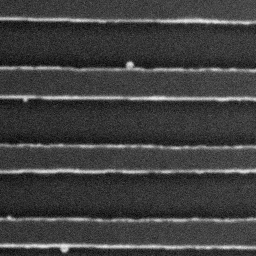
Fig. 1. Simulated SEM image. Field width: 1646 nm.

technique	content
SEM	lines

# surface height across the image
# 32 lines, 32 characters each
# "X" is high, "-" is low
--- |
XXXXXXXXXXXXXXXXXXXXXXXXXXXXXXXX
XXXXXXXXXXXXXXXXXXXXXXXXXXXXXXXX
---------XXXXXXXXXXXXXXXXXXXXXXX
--------------------------------
--------------------------------
--------------------------------
--------------------------------
--------------------------------
XXXXXXXX------------------------
XXXXXXXXXXXXXXXXXXXXXXXXXXXXXXXX
XXXXXXXXXXXXXXXXXXXXXXXXXXXXXXXX
XXXXXXXXXXXXXXXXXXXXXXXXXXXXXXXX
--------------------------------
--------------------------------
--------------------------------
--------------------------------
--------------------------------
--------------------------------
XXXXXXXXXXXXXXXXXXXXXXXXXXXXXXXX
XXXXXXXXXXXXXXXXXXXXXXXXXXXXXXXX
XXXXXXXXXXXXXXXXXXXXXXXXXXXXXXXX
XXX------XXXX--XXX--XX--XX----X-
--------------------------------
--------------------------------
--------------------------------
--------------------------------
--------------------------------
XXXXXXXXXXXXX-XXXXXXXXXXXXXXXXXX
XXXXXXXXXXXXXXXXXXXXXXXXXXXXXXXX
XXXXXXXXXXXXXXXXXXXXXXXXXXXXXXXX
XXXXXXXXXXXXXXXXXXXXXXXXXXXXXXXX
--------------------------------